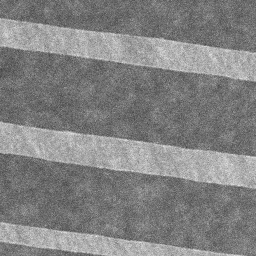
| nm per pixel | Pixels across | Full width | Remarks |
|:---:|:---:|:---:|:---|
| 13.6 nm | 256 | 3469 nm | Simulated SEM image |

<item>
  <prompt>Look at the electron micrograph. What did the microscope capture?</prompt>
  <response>one or a few lines or trenches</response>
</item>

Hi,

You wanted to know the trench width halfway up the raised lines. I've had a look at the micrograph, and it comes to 989 nanometres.